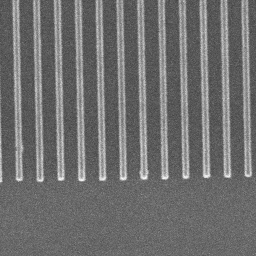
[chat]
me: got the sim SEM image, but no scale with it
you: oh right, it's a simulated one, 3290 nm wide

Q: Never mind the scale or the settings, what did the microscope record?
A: parallel lines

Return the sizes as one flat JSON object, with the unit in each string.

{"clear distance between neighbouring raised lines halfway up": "198 nm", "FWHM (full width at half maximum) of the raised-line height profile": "0.0626 micrometres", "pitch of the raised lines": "267 nanometers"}